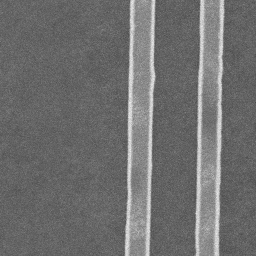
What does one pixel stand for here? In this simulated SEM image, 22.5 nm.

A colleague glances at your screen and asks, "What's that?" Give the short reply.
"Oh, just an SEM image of one or a few lines or trenches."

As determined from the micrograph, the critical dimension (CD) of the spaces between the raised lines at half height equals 49.2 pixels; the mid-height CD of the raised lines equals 456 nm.